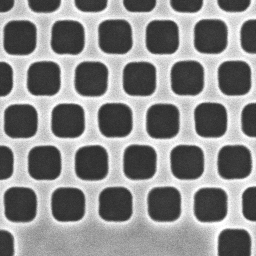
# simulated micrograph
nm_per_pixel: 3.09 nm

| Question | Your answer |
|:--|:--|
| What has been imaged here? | a regular array of holes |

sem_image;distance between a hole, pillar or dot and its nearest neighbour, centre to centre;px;47.3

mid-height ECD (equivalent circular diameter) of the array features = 113 nm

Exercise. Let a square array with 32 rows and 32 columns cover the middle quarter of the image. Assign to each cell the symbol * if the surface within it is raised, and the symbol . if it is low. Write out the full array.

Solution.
***........****........****.....
***........****........****.....
***........****........***......
***........****........***......
***........****........****.....
***........****........****.....
***........****........****.....
****......******......******....
********************************
********************************
....*****.......******......****
.....****........****........***
.....***.........****........***
.....***.........****........***
.....****........****........***
.....****........****........***
.....****........****........***
....*****.......*****.......****
...********...********.....*****
********************************
*****....*******......******....
****.......****........****.....
***........****........****.....
***........****........****.....
***........****........****.....
***........****........****.....
***........****........****.....
***........****........****.....
****......******......******....
********************************
********************************
....******......******......****